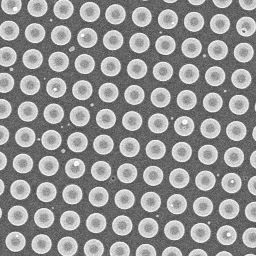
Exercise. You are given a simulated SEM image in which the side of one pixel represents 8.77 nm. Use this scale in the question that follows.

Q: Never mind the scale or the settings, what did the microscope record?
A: an array of small figures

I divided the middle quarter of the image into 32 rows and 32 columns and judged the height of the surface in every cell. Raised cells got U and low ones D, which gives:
UDDUUUUDDUUUUUDDUUUUUDDUUUUDDDUU
DDDUUUUDDUUUUUDDUUUUUDUUUUUDDUUU
DDDDDDDDDDUUUDDDUUUUDDUUUUUDDUUU
DDDDDDDDDDDDDDDDDUUDDDDUUUUDDUUU
DDDDUUDDDDDDDDDDDDDDDDDDDDDDDDUU
DDUUUUUDDUUUUDDDDUDDDDDDDDDDDDDD
DDUUUUUDDUUUUDDDUUUUDDDUUUDDDDDD
DDUUUUUDDUUUUDDUUUUUDDUUUUDDDUUU
DDDUUUDDDUUUUDDUUUUUDDUUUUDDUUUU
DDDDDDDDDDDDDDDDUUUDDDUUUUDDUUUU
DDDDDDDDDDDDDDDDDDDDDDDUUDDDDUUU
DDUUUUDDDUUDDDDDDDDDDDDDDDDDDDDD
DDUUUUDDUUUUUDDUUUUDDDDUDDDDDDDD
DDUUUUDDUUUUUDDUUUUDDDUUUUDDDUUD
DDUUUUDDUUUUUDDUUUUDDUUUUUDDUUUU
DDDDDDDDDUUUDDDUUUUDDUUUUUDDUUUU
DDDDDDDDDDDDDDDDUUDDDDUUUDDDUUUU
DDUUUDDDDDDDDDDDDDDDDDDDDDDDDUUD
DUUUUUDDUUUUDDDDUDDDDDDDDDDDDDDD
DUUUUUDUUUUUDDUUUUDDDUUUDDDDDDDD
DUUUUUDUUUUUDDUUUUUDDUUUUDDDUUUD
DDUUUDDDUUUUDDUUUUUDDUUUUDDUUUUU
DDDDDDDDDUUDDDDUUUDDDUUUUDDUUUUU
DDDDDDDDDDDDDDDDDDDDDDUUDDDDUUUD
DUUUUDDDUUDDDDDDDDDDDDDDDDDDDDDD
UUUUUDDUUUUDDDUUUDDDDDDDDDDDDDDD
UUUUUDDUUUUUDUUUUUDDUUUUDDDDUUDD
DUUUUDDUUUUUDUUUUUDDUUUUUDDUUUUD
DDDDDDDDUUUDDDUUUUDDUUUUUDUUUUUD
DDDDDDDDDDDDDDDUUDDDUUUUDDDUUUUD
DUUDDDDDDDDDDDDDDDDDDDDDDDDUUUDD
UUUUDDDUUUDDDDUUDDDDDDDDDDDDDDDD